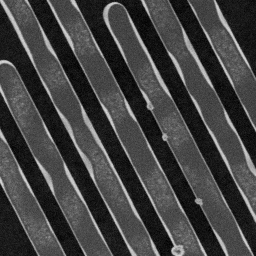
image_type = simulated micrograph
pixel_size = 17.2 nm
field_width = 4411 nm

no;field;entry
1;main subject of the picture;groups of lines, slits or small figures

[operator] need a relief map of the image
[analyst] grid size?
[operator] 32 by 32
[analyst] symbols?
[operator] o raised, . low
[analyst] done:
oooo..ooo.....o...ooo...ooo.....
.ooo...ooo...ooo..oooo..ooo.....
..ooo..oooo..ooo...ooo...ooo....
..ooo...ooo...ooo..oooo..ooo....
...ooo..oooo..ooo...ooo...ooo...
...ooo...ooo...ooo..oooo..oooo..
....ooo..oooo..ooo...ooo...ooo..
....ooo...ooo...ooo...ooo..oooo.
oo..oooo..oooo..ooo...ooo...ooo.
oo...ooo...ooo...ooo...ooo..oooo
ooo..oooo..oooo..ooo...ooo...ooo
ooo...ooo...ooo...ooo...ooo..ooo
.ooo...ooo..oooo..oooo..ooo...oo
.oooo..ooo...ooo...ooo...ooo..oo
..ooo...ooo...ooo..oooo..ooo...o
..ooo...ooo...ooo...ooo...ooo...
...ooo...ooo..oooo..oooo..oooo..
o..oooo..ooo...ooo...ooo...ooo..
o...ooo...ooo..oooo..oooo..ooo..
oo..oooo..ooo...ooo...ooo...ooo.
oo...ooo...ooo..oooo..oooo..ooo.
ooo...ooo..ooo...ooo...ooo...ooo
ooo...ooo...ooo...ooo..oooo..ooo
oooo..ooo...ooo...ooo...ooo...oo
.ooo...ooo...ooo...ooo..oooo..oo
.oooo..oooo..ooo...ooo...ooo...o
..ooo...ooo...ooo...ooo..oooo..o
..oooo..oooo..oooo..oooo..ooo...
...ooo...ooo...ooo...ooo..oooo..
....ooo..oooo..oooo..oooo..ooo..
....ooo...ooo...ooo...ooo...ooo.
.....ooo...ooo...ooo..oooo..ooo.